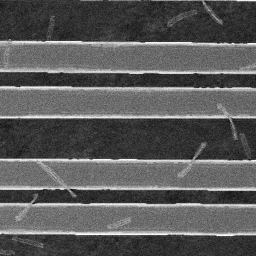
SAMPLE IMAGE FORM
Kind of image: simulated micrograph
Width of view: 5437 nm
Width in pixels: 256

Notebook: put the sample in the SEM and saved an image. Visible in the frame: lines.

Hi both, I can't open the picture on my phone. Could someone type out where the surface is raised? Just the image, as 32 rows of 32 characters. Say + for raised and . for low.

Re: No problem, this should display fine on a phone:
................................
................................
................................
................................
................................
+++++++++++++++++++++++++.......
++++++++++++++++++++++++++++++++
++++++++++++++++++++++++++++++++
++++++++++++++++++++++++++++++++
................................
................................
++++++++++++++++++++++++++++++++
++++++++++++++++++++++++++++++++
++++++++++++++++++++++++++++++++
++++++++++++++++++++++++++++++++
................................
................................
................................
................................
................................
++++++++++++++++++++++++++++++++
++++++++++++++++++++++++++++++++
++++++++++++++++++++++++++++++++
++++++++++++++++++++++++++++++++
................................
...++...........................
++++++++++++++++++++++++++++++++
++++++++++++++++++++++++++++++++
++++++++++++++++++++++++++++++++
................................
................................
................................